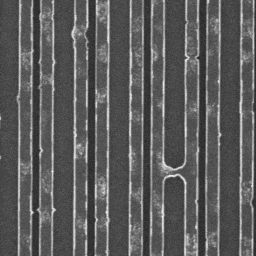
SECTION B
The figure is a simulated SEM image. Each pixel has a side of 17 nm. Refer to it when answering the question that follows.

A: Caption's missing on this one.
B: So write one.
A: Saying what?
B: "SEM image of parallel lines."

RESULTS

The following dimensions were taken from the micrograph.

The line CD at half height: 221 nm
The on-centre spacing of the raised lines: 471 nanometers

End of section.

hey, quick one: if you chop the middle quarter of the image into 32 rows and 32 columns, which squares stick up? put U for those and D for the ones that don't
DDDUUUDDUUUDDDDDDUUUDDUUUDDDDDDU
DDDUUUDDUUUDDDDDDUUUDDUUUDDDDDUU
DDDUUUDDUUUDDDDDDUUUDDUUUDDDDDUU
DDDUUUDDUUUDDDDDDUUUDDUUUDDDDDUU
DDDUUUDDUUUDDDDDDUUUDDUUUDDDDDUU
DDDUUUDDUUUDDDDDDUUUDDUUUDDDDDUU
DDDUUUDDUUUDDDDDDUUUDDUUUDDDDDDU
DDDUUUDDUUUDDDDDDUUUDDUUUDDDDDDU
DDDUUUDDUUUDDDDDDUUUDDUUUDDDDDDU
DDDUUUDDUUUDDDDDDUUUDDUUUDDDDDDU
DDDUUUDDUUUDDDDDDUUUDDUUUDDDDDDU
DDDUUUDDUUUDDDDDDUUUDDUUUDDDDDDU
DDDUUUDDUUUDDDDDDUUUDDUUUDDDDDUU
DDDUUUDDUUUDDDDDDUUUDDUUUDDDDDUU
DDDUUUDDUUUDDDDDDUUUDDUUUDDDDDUU
DDDUUUDDUUUDDDDDDUUUDDUUUDDDDDUU
DDDUUUDDUUUDDDDDDUUUDDUUUDDDDDUU
DDDUUUDDUUUDDDDDDUUUDDUUUDDDDDUU
DDDUUUDDUUUDDDDDDUUUDDUUUDDDDDUU
DDDUUUDDUUUDDDDDDUUUDDUUUDDDDDUU
DDDUUUDDUUUDDDDDDUUUDDUUUDDDDDUU
DDDUUUDDUUUDDDDDDUUUDDUUUDDDDDUU
DDDUUUDDUUUDDDDDUUUUDDUUUDDDDDUU
DDDUUUDDUUUDDDDDUUUUDDUUUDDDDDUU
DDDUUUDDUUUDDDDDDUUUDDUUUDDDDDUU
DDDUUUDDUUUDDDDDUUUUDDUUUDDDDDUU
DDDUUUDDUUUDDDDDUUUUDDUUUUUUUUUU
DDDUUUDDUUUDDDDDDUUUDDUUUUUUUUUU
DDDUUUDDUUUDDDDDDUUUDDUUUDDDDDUU
DDDUUUDDUUUDDDDDDUUDDDUUUDDDDDUU
DDDUUUDDUUUDDDDDUUUDDDUUUDDDDDUU
DDDUUUDDUUUDDDDDUUUDDDUUUDDDDDUU